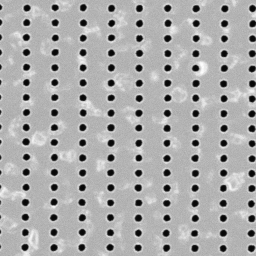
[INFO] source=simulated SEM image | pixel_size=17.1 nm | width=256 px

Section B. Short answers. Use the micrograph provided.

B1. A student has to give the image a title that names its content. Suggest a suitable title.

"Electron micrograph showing a regular array of holes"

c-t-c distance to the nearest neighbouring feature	254	nm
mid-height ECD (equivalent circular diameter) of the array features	127	nm